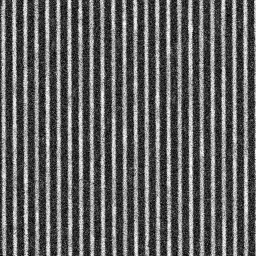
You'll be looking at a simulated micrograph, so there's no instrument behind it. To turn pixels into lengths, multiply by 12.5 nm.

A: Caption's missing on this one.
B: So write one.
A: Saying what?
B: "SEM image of parallel lines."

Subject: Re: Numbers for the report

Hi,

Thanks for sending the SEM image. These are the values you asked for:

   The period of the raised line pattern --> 137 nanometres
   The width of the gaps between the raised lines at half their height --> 99.7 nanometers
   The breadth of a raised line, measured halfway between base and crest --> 0.0327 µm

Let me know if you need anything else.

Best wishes